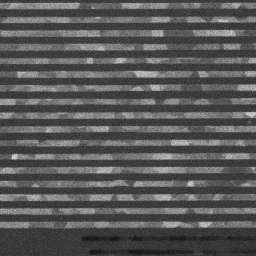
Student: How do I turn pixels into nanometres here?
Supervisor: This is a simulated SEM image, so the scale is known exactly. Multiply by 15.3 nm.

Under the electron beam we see parallel lines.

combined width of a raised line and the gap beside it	0.21	micrometres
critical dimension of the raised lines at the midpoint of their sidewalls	82.4	nm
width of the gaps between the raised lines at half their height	8.38	pixels